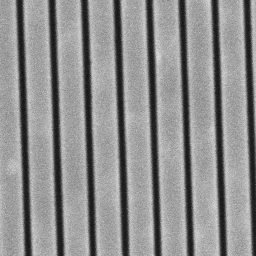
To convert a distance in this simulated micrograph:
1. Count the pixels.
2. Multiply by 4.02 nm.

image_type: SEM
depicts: parallel lines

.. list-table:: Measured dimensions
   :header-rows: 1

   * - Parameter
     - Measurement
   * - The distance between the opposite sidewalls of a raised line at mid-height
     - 0.0988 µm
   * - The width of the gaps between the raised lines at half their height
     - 29.6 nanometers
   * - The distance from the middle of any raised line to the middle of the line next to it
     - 0.131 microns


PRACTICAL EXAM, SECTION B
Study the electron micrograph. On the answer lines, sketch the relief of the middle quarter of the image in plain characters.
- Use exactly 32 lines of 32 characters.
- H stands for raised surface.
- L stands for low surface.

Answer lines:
HHHHHLLHHHHHHLLHHHHHHLLHHHHHHLLH
HHHHHLLHHHHHHLLHHHHHHLLHHHHHHLLH
HHHHHLLHHHHHHLLHHHHHHLLHHHHHHLLH
HHHHHLLHHHHHHLLHHHHHHLLHHHHHHLLH
HHHHHLLHHHHHHLLHHHHHHLLHHHHHHLLH
HHHHHLLHHHHHHLLHHHHHHLLHHHHHHLLH
HHHHHLLHHHHHHLLHHHHHHLLHHHHHHLLH
HHHHHLLHHHHHHLLHHHHHHLLHHHHHHLLH
HHHHHLLHHHHHHLLHHHHHHLLHHHHHHLLH
HHHHHLLHHHHHHLLHHHHHHLLHHHHHHHLH
HHHHHLLHHHHHHLLHHHHHHLLHHHHHHHLH
HHHHHLLHHHHHHLLHHHHHHLLHHHHHHHLH
HHHHHLLHHHHHHLLHHHHHHLLHHHHHHHLH
HHHHHLLHHHHHHLLHHHHHHLLHHHHHHHLH
HHHHHLLHHHHHHLLHHHHHHLLLHHHHHHLL
HHHHHLLHHHHHHLLHHHHHHLLLHHHHHLLL
HHHHHLLHHHHHHLLHHHHHHLLLHHHHHHLL
HHHHHLLHHHHHHLLHHHHHHLLLHHHHHHLL
HHHHHLLHHHHHHLLHHHHHHLLLHHHHHHLL
HHHHHLLHHHHHHLLHHHHHHLLHHHHHHHLL
HHHHHLLHHHHHHLLLHHHHHHLLHHHHHHLL
HHHHHLLHHHHHHHLLHHHHHHLLHHHHHHLL
HHHHHLLLHHHHHHLLHHHHHHLLHHHHHHLL
HHHHHLLHHHHHHHLLHHHHHHLLHHHHHHLL
HHHHHLLHHHHHHHLLHHHHHHLLHHHHHHLL
HHHHHLLHHHHHHHLLHHHHHHLLHHHHHHLL
HHHHHLLLHHHHHHLLHHHHHHLLHHHHHHLL
HHHHHHLLHHHHHHLLHHHHHHLLHHHHHHLL
HHHHHHLLHHHHHHLLHHHHHHLLHHHHHHLL
HHHHHHLLHHHHHHLLHHHHHHLLHHHHHHLL
HHHHHHLLHHHHHHLLHHHHHHLLHHHHHHLL
HHHHHHLLHHHHHHLLHHHHHHLLHHHHHHLL